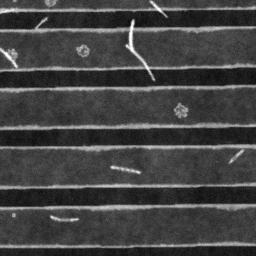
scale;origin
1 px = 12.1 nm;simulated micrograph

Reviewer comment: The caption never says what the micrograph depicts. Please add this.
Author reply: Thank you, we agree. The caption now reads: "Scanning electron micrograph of lines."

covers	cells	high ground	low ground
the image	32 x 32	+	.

++++++++++++++++++++++++++++++++
+...............................
................................
................+...........++++
++++++++++++++++++++++++++++++++
++++++++++++++++++++++++++++++++
++++++++++++++++++++++++++++++++
++++++++++++++++++++++++++++++++
++++++++++++++++++++.++.........
................................
................................
++++++++++++++++++++++++++++++++
++++++++++++++++++++++++++++++++
++++++++++++++++++++++++++++++++
++++++++++++++++++++++++++++++++
++++++++++++++++++++++++++++++++
................................
................................
++.+++++++++++++++++++++++++++++
++++++++++++++++++++++++++++++++
++++++++++++++++++++++++++++++++
++++++++++++++++++++++++++++++++
++++++++++++++++++++++++++++++++
................................
................................
................................
++++++++++++++++++++++++++++++++
++++++++++++++++++++++++++++++++
++++++++++++++++++++++++++++++++
++++++++++++++++++++++++++++++++
++++++++++++++++++++++++++++++++
................................